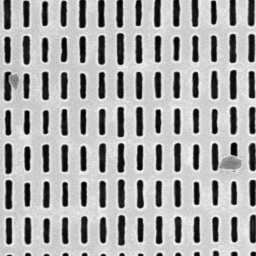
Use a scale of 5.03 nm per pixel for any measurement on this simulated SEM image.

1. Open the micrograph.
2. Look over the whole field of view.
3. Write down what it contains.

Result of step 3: a regular array of holes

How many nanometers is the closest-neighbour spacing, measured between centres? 93.1